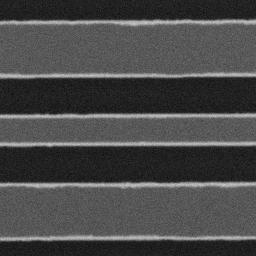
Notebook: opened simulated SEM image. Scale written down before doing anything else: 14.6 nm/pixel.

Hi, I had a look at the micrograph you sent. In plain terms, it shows lines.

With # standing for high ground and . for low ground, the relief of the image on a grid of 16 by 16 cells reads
................
################
################
################
################
................
................
################
################
................
................
################
################
################
################
................